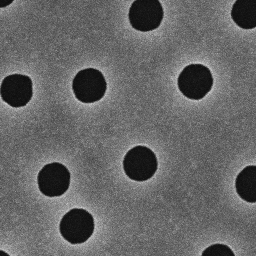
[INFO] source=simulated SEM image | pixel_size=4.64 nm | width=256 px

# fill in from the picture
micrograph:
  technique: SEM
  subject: holes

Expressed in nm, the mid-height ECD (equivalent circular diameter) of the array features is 164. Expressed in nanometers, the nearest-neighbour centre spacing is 408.